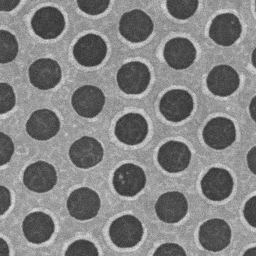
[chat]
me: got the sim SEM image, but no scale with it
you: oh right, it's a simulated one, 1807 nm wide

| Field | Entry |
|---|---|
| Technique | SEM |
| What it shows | a regular array of holes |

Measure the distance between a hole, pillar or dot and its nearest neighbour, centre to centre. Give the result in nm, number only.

358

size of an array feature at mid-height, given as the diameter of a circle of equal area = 238 nm